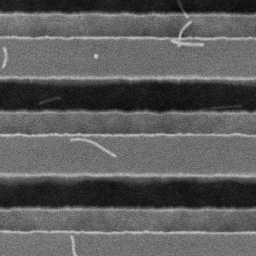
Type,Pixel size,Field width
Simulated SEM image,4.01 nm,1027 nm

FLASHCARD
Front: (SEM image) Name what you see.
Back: lines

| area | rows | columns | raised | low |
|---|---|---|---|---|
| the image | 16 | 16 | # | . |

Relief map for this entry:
................
################
################
################
################
................
................
################
################
################
################
................
................
################
################
################